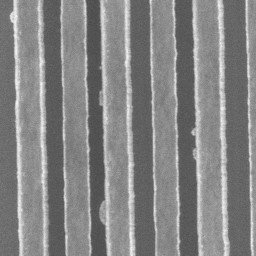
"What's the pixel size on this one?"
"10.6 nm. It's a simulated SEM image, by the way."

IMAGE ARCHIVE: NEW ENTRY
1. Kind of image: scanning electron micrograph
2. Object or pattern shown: lines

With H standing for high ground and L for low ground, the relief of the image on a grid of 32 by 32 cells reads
LLHHHLLLHHHLLHHHLLLHHHLLHHHHLLLH
LLHHHLLLHHHLLHHHLLLHHHLLHHHHLLLH
LLHHHLLLHHHLLHHHLLLHHHLLHHHHLLLH
LLHHHLLLHHHLLHHHLLLHHHLLHHHHLLLH
LLHHHLLLHHHLLHHHLLLHHHLLHHHHLLLH
LLHHHLLLHHHLLHHHLLLHHHLLHHHHLLLH
LLHHHLLLHHHLLHHHLLLHHHLLHHHHLLLH
LLHHHLLLHHHLLHHHLLLHHHLLHHHHLLLH
LLHHHLLLHHHLLHHHLLLHHHLLHHHHLLLH
LLHHHLLLHHHLLHHHLLLHHHLLHHHHLLLH
LLHHHLLLHHHLLHHHLLLHHHLLHHHHLLLH
LLHHHLLLHHHLLHHHLLLHHHLLHHHHLLLH
LLHHHLLLHHHLLHHHLLLHHHLLHHHHLLLH
LLHHHLLLHHHLLHHHLLLHHHLLHHHHLLLH
LLHHHLLLHHHLLHHHLLLHHHLLLHHHLLLH
LLHHHLLLHHHLLHHHLLLHHHLLLHHHLLLH
LLHHHLLLHHHLLHHHLLLHHHLLLHHHLLLH
LLHHHLLLHHHLLHHHLLLHHHLLLHHHLLLH
LLHHHHLLHHHLLHHHLLLHHHLLLHHHLLLH
LLHHHHLLHHHLLHHHLLLHHHLLLHHHLLLH
LLHHHHLLHHHLLHHHLLLHHHLLLHHHLLLH
LLHHHHLLHHHLLHHHLLLHHHLLLHHHLLLH
LLHHHHLLHHHLLHHHLLLHHHLLLHHHLLLH
LLHHHHLLHHHLLHHHLLLHHHLLLHHHLLLH
LLHHHHLLHHHLLHHHHLLHHHLLLHHHLLLH
LLHHHHLLHHHLLHHHLLLHHHLLLHHHLLLH
LLHHHHLLHHHLLHHHHLLHHHLLLHHHLLLH
LLHHHHLLHHHLLHHHHLLHHHLLLHHHLLLH
LLHHHHLLHHHLLHHHHLLHHHLLLHHHLLLH
LLHHHHLLHHHLLHHHHLLLHHLLLHHHLLLH
LLHHHHLLHHHLLHHHHLLLHHLLLHHHLLLH
LLHHHHLLHHHLLHHHHLLLHHLLLHHHLLLH